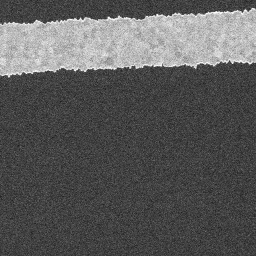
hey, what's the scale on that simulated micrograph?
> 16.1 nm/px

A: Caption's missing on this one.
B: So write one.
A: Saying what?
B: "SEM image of one or a few lines or trenches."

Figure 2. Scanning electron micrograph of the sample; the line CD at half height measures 800 nm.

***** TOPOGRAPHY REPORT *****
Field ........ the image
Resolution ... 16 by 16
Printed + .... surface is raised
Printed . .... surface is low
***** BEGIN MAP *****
................
++++++++++++++++
++++++++++++++++
++++++++++++++++
++..............
................
................
................
................
................
................
................
................
................
................
................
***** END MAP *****